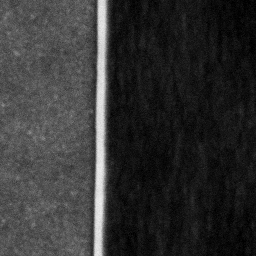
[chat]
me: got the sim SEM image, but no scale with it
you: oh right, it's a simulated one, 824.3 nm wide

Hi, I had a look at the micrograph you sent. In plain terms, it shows one or a few lines or trenches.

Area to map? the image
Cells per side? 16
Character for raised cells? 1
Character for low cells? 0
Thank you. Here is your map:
0000001111111111
0000001111111111
0000001111111111
0000001111111111
0000001111111111
0000001111111111
0000001111111111
0000001111111111
0000001111111111
0000001111111111
0000001111111111
0000001111111111
0000001111111111
0000001111111111
0000001111111111
0000001111111111